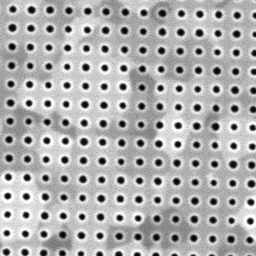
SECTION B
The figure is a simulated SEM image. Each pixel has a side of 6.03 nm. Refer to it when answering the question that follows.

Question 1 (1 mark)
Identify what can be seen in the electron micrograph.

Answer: a regular array of holes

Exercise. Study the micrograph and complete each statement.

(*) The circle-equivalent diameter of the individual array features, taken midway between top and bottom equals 48.3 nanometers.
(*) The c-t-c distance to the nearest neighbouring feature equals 111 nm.